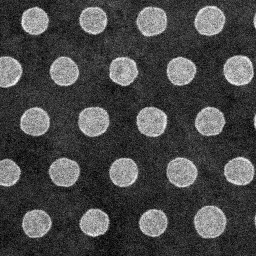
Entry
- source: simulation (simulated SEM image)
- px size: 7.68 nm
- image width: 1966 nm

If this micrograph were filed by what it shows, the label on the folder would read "a regular array of raised bodies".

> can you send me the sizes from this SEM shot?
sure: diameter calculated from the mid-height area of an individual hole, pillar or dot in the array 27.7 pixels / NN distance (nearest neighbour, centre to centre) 57.5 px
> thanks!